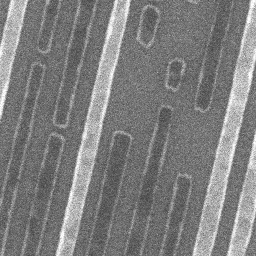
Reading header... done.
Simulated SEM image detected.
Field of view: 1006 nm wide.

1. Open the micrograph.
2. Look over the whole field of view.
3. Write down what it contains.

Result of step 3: parallel lines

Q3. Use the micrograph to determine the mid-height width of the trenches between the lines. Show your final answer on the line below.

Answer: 71.7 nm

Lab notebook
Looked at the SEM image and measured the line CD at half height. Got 15.7 pixels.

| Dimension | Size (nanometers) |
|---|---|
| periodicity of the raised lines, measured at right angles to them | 132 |